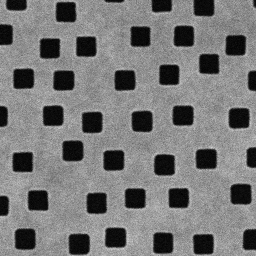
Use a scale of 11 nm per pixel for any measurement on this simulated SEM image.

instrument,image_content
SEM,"a regular array of holes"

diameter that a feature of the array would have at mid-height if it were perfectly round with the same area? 0.256 µm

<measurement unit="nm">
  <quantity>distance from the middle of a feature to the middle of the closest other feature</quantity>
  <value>438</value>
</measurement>